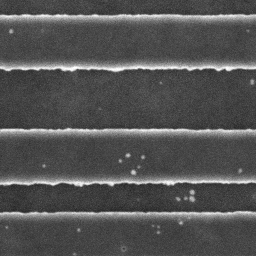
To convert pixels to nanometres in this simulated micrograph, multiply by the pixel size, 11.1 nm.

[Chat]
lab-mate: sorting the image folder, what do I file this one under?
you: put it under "lines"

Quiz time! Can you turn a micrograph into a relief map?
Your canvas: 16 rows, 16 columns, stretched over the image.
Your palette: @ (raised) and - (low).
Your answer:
----------------
@@@@@@@@@@@@@@@@
@@@@@@@@@@@@@@@@
@@@@@@@@@@@@@@@@
----------------
----------------
----------------
----------------
@@@@@@@@@@@@@@@@
@@@@@@@@@@@@@@@@
@@@@@@@@@@@@@@@@
----------------
----------------
@@@@@@@@@@@@@@@@
@@@@@@@@@@@@@@@@
@@@@@@@@@@@@@@@@